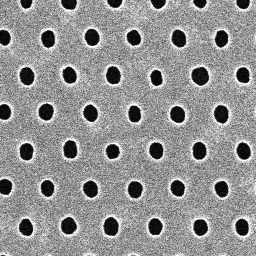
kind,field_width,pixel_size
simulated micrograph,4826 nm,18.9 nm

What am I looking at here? a regular array of holes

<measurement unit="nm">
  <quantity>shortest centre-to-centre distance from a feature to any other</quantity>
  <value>801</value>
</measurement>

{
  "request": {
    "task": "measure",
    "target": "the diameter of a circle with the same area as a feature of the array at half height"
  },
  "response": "302 nanometers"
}